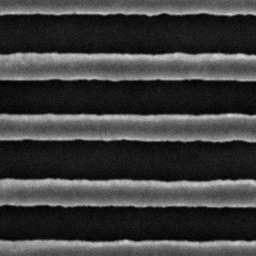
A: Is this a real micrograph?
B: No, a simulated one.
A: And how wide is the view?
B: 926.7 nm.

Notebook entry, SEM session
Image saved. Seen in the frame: lines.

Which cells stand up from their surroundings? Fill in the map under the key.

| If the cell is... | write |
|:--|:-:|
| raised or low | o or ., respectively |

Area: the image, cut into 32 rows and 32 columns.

oooooooooooooooooooooooooooooooo
oooooooooooooooooooooooooooooooo
................................
................................
................................
................................
................................
oooooooooooooooooooooooooooooooo
oooooooooooooooooooooooooooooooo
oooooooooooooooooooooooooooooooo
................................
................................
................................
................................
...........................oooo.
oooooooooooooooooooooooooooooooo
oooooooooooooooooooooooooooooooo
..................oo.ooo.oooo.oo
................................
................................
................................
................................
................................
oooooooooooooooooooooooooooooooo
oooooooooooooooooooooooooooooooo
oooooooooooooooooooooooooooooooo
................................
................................
................................
................................
o.oooooooooooooooooooooooooooooo
oooooooooooooooooooooooooooooooo